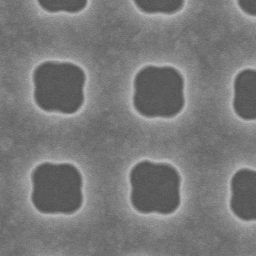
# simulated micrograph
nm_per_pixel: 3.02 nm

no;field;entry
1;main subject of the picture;holes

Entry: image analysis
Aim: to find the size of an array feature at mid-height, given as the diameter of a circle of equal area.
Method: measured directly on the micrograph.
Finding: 162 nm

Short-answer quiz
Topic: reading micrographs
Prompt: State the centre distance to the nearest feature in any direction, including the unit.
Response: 293 nanometres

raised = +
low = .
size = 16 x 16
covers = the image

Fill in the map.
+++..++++..++++.
++++++++++++++++
++++++++++++++++
++++++++++++++++
++...++++..++++.
++...+++...++++.
++...+++...++++.
++++++++++++++++
++++++++++++++++
++++++++++++++++
++...+++...+++++
++...+++...+++..
++...+++...+++..
+++++++++++++++.
++++++++++++++++
++++++++++++++++